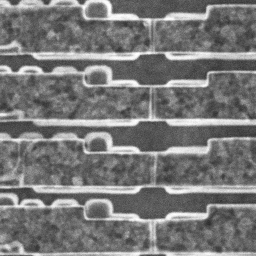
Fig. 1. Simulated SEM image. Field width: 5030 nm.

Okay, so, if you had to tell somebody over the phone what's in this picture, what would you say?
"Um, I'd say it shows wiring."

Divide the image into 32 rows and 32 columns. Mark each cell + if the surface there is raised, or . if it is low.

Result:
................................
+++++++++++...............++++++
++++++++++++++++++++++++++++++++
++++++++++++++++++++++++++++++++
++++++++++++++++++++++++++++++++
++++++++++++++++++++++++++++++++
..++++++++++++++++++++++++++++++
................................
................................
++++++++++................++++++
+++++++++++...............++++++
++++++++++++++++++++++++++++++++
++++++++++++++++++++++++++++++++
++++++++++++++++++++++++++++++++
++++++++++++++++++++++++++++++++
................................
................................
+......++.................++++++
+++++++++++...............++++++
++++++++++++++++++++++++++++++++
++++++++++++++++++++++++++++++++
++++++++++++++++++++++++++++++++
++++++++++++++++++++++++++++++++
................................
................................
................................
+++++++++++...............++++++
++++++++++++++++......++++++++++
++++++++++++++++++++++++++++++++
++++++++++++++++++++++++++++++++
++++++++++++++++++++++++++++++++
..++++++++++++++++++++++++++++++